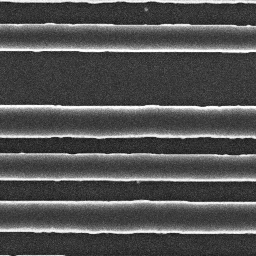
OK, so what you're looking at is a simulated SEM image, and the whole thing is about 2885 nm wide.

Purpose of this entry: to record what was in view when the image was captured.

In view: lines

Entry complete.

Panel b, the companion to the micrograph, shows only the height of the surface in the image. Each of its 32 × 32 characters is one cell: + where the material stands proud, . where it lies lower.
................................
................................
................................
++++++++++++++++++++++++++++++++
++++++++++++++++++++++++++++++++
++++++++++++++++++++++++++++++++
................................
................................
................................
................................
................................
................................
................................
++++++++++++++++++++++++++++++++
++++++++++++++++++++++++++++++++
++++++++++++++++++++++++++++++++
++++++++++++++++++++++++++++++++
................................
................................
+++++++++++++++++++++++++++++.++
++++++++++++++++++++++++++++++++
++++++++++++++++++++++++++++++++
........................+++.....
................................
................................
++++++++++++++++++++++++++++++++
++++++++++++++++++++++++++++++++
++++++++++++++++++++++++++++++++
++++++++++++++++++++++++++++++++
................................
................................
................................